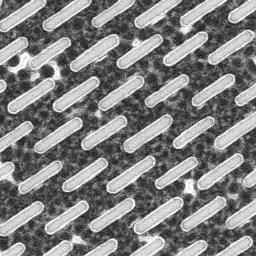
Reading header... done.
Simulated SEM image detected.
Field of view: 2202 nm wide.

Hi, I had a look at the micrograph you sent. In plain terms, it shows a regular array of holes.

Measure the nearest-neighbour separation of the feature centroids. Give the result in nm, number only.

381